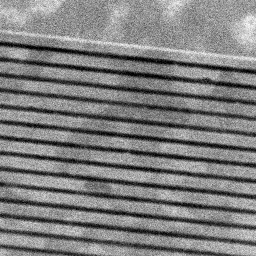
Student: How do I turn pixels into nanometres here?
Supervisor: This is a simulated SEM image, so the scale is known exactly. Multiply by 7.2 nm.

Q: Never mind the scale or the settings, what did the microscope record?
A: parallel lines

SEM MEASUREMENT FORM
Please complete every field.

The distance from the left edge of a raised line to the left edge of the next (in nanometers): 112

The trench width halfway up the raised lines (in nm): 42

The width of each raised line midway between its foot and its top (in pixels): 9.69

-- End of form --